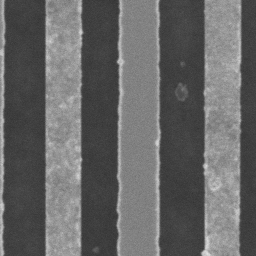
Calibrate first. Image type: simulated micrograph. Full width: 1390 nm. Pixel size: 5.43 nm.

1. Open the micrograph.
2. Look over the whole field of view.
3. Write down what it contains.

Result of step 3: lines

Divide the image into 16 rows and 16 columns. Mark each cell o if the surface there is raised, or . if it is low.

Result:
...oo..ooo...oo.
...oo..ooo...oo.
...oo..ooo...oo.
...oo..ooo...oo.
...oo..ooo...oo.
...oo..ooo...oo.
...oo..ooo...oo.
...oo..ooo...oo.
...oo..ooo...oo.
...oo..ooo...oo.
...oo..ooo...oo.
...oo..ooo...oo.
...oo..ooo...oo.
...oo..ooo...oo.
...oo..ooo...oo.
...oo..ooo...oo.